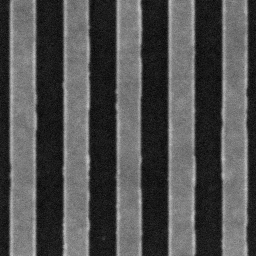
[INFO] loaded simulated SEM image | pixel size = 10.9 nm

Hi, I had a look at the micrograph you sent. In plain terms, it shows lines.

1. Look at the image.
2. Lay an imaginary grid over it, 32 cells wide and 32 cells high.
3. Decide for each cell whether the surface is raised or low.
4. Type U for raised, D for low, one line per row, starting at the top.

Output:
DUUUDDDDUUUDDDDUUDDDDUUUDDDDUUUD
DUUUDDDDUUUDDDDUUUDDDUUUDDDDUUUD
DUUUDDDDUUUDDDDUUUDDDUUUDDDDUUUD
DUUUDDDDUUUDDDDUUUDDDUUUDDDDUUUD
DUUUDDDDUUUDDDDUUUDDDUUUDDDDUUUD
DUUUDDDDUUUDDDDUUUDDDUUUDDDDUUUD
DUUUDDDDUUUDDDDUUDDDDUUUDDDDUUUD
DUUUDDDDUUUDDDDUUUDDDUUUDDDDUUUD
DUUUDDDDUUUDDDDUUUDDDUUUDDDDUUUD
DUUUDDDDUUUDDDDUUDDDDUUUDDDDUUUD
DUUUDDDDUUUDDDDUUUDDDUUUDDDDUUUD
DUUUDDDDUUUDDDDUUUDDDUUUDDDDUUUD
DUUUUDDDUUUDDDDUUDDDDUUUDDDDUUUD
DUUUDDDDUUUDDDDUUDDDDUUUDDDDUUUD
DUUUUDDDUUUDDDDUUDDDDUUUDDDDUUUD
DUUUUDDDUUUDDDDUUDDDDUUUDDDDUUUD
DUUUUDDDUUUDDDDUUDDDDUUUDDDDUUUD
DUUUDDDDUUUDDDDUUDDDDUUUDDDDUUUD
DUUUDDDDUUUDDDDUUDDDDUUUDDDDUUUD
DUUUDDDDUUUDDDDUUUDDDUUUDDDDUUUD
DUUUDDDDUUUDDDDUUUDDDUUUDDDDUUUD
DUUUDDDDUUUDDDDUUDDDDUUUDDDDUUUD
DUUUDDDDUUUDDDDUUDDDDUUUDDDDUUUD
DUUUDDDDUUUDDDDUUDDDDUUUDDDDUUUD
DUUUDDDDUUUDDDDUUUDDDUUUDDDDUUUD
DUUUDDDDUUUDDDDUUUDDDUUUDDDDUUUD
DUUUDDDDUUUDDDDUUUDDDUUUDDDDUUUD
DUUUDDDDUUUDDDDUUUDDDUUUDDDDUUUD
DUUUDDDDUUUDDDDUUUDDDUUUDDDDUUUD
DUUUDDDDUUUDDDDUUUDDDUUUDDDDUUUD
DUUUDDDDUUUDDDDUUUDDDUUUDDDDUUUD
DUUUDDDDUUUDDDDUUUDDDUUUDDDDUUUD